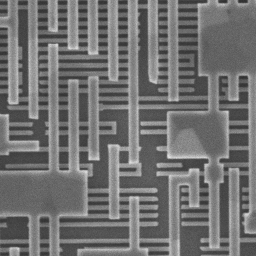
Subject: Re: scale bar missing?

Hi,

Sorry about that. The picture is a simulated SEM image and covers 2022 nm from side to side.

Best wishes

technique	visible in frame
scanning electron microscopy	wiring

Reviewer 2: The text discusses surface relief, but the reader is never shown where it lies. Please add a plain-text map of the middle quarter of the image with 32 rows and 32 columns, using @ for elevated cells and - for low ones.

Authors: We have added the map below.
-----------@@---@@---@@---@@----
-----------@@---@@---@@---@@----
-----------@@---@@---@@---@@----
------@@@--@@---@@---@@---@@----
-@@---@@@-------@@----@---@@----
-@@---@@@-------@@--------@@----
-@@---@@@-------@@--------@@----
-@@---@@@-------@@--------@@----
-@@---@@@-------@@--------@@----
-@@---@@@-------@@--------------
-@@---@@@-------@@--------------
-@@---@@@-------@@--------------
-@@---@@@-------@@--------@@@@@@
-@@---@@@-------@@@-------@@@@@@
-@@---@@@-------@@@-------@@@@@@
-@@---@@@-------@@@-------@@@@@@
-@@---@@@-------@@@-------@@@@@@
-@@---@@@-------@@@-------@@@@@@
-@@---@@@-------@@@-------@@@@@@
-@@---@@@-------@@@-------@@@@@@
-@@@--@@@--@@@--@@@-------@@@@@@
-@@@--@@@--@@@--@@@-------@@@@@@
-@@@--@@@--@@@--@@@-------@@@@@@
-@@@--@@@--@@@--@@@-------@@@@@@
-@@@-------@@@--@@@-------------
-@@@-------@@@------------------
-@@@-------@@@-----------------@
@@@@@@-----@@@-----------------@
@@@@@@-----@@@------------@@@@@@
@@@@@@-----@@@------------@@@@@@
@@@@@@-----@@@------------@@@--@
@@@@@@-----@@@------------@@@--@